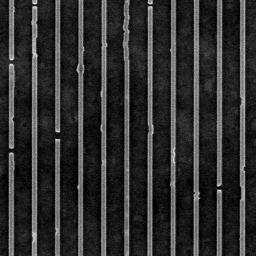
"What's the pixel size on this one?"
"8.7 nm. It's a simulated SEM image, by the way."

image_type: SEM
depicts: parallel lines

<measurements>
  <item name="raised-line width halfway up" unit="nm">32.6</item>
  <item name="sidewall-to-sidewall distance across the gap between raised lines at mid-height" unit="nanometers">168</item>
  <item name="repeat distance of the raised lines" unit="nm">201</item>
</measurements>